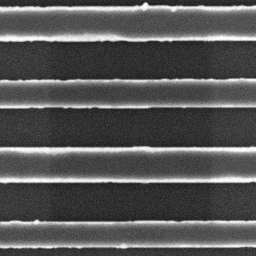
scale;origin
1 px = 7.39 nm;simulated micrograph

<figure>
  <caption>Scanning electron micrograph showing lines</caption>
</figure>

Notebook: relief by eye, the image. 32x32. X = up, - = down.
--------------------------------
XXXXXXXXXXXXXXXXXXXXXXXXXXXXXXXX
XXXXXXXXXXXXXXXXXXXXXXXXXXXXXXXX
XXXXXXXXXXXXXXXXXXXXXXXXXXXXXXXX
XXXXXXXXXXXXXXXXXXXXXXXXXXXXXXXX
--------------------------------
--------------------------------
--------------------------------
--------------------------------
--------------------------------
XXXXXXXXXXXXXXXXXXXXXXXXXXXXXXXX
XXXXXXXXXXXXXXXXXXXXXXXXXXXXXXXX
XXXXXXXXXXXXXXXXXXXXXXXXXXXXXXXX
--------------------------------
--------------------------------
--------------------------------
--------------------------------
--------------------------------
--------------------------------
XXXXXXXXXXXXXXXXXXXXXXXXXXXXXXXX
XXXXXXXXXXXXXXXXXXXXXXXXXXXXXXXX
XXXXXXXXXXXXXXXXXXXXXXXXXXXXXXXX
XXXXXXXXXXXXXXXXXXXXXXXXXXXXXXXX
--------------------------------
--------------------------------
--------------------------------
--------------------------------
--------------------------------
XXXXXXXXXXXXXXXXXXXXXXXXXXXXXXXX
XXXXXXXXXXXXXXXXXXXXXXXXXXXXXXXX
XXXXXXXXXXXXXXXXXXXXXXXXXXXXXXXX
--------------------------------